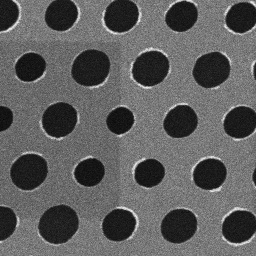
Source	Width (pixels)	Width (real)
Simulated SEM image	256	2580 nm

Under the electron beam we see a regular array of holes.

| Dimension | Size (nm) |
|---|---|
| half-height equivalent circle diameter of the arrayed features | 350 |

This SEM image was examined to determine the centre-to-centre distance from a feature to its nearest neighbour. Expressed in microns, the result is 0.604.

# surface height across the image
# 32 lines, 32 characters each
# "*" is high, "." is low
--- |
..****...*****...*****..*****..*
..****....***....****....***....
..****....***....****....***....
.*****...****....****...*****..*
********************************
********************************
**********...*****..************
**....***.....***....****....***
**....***.....***....***.....***
**...****....****....***.....***
**********...*****..*****...****
********************************
********************************
.*****...******.******..*****..*
..***.....***....****....***....
.****....****....***.....***....
******...*****..*****...****....
********************************
********************************
***..***************************
**....****...****...*****...****
*.....***....****....***....****
**....***....****...****....****
**...********************..*****
********************************
********************************
..****...*****..*****...*****..*
..***.....***....***.....***....
..***.....***....***.....***....
.****....****...****....****...*
*******.************************
********************************